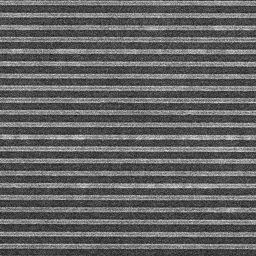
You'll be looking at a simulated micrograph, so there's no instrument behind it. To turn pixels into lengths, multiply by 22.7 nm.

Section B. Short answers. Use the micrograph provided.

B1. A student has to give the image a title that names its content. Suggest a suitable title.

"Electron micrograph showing parallel lines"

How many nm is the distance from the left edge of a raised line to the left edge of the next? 277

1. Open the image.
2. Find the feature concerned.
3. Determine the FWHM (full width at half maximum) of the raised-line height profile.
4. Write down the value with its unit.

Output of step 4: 93.7 nanometers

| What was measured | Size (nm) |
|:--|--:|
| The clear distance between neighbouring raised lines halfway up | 187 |